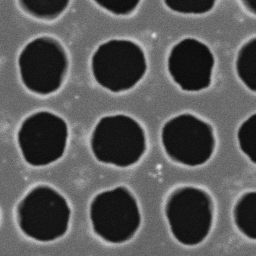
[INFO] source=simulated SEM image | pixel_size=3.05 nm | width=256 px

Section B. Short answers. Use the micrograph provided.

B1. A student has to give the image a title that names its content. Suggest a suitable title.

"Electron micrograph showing a regular array of holes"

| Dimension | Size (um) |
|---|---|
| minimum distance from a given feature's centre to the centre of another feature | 0.221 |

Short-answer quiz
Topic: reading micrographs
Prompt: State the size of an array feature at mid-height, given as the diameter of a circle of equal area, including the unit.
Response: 0.159 µm